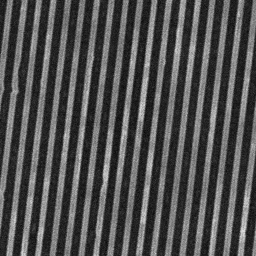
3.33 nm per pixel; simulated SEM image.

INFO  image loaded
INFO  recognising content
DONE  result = parallel lines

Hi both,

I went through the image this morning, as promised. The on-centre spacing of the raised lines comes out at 47.8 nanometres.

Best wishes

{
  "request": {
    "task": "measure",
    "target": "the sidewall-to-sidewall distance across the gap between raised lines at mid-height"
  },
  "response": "29.3 nm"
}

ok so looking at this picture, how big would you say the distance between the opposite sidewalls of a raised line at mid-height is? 16.5 nm